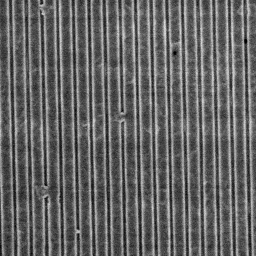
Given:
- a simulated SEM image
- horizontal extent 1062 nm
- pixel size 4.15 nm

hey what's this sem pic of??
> parallel lines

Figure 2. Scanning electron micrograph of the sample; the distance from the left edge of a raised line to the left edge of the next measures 64.7 nm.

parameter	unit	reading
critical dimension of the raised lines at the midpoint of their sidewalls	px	12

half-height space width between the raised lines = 0.0145 micrometres